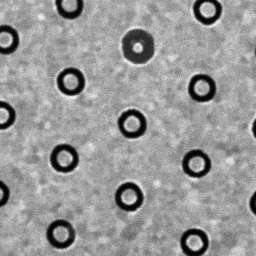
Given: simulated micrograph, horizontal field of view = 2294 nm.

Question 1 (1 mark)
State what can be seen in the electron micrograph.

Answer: a regular array of ring-shaped grooves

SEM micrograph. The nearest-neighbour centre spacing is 673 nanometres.